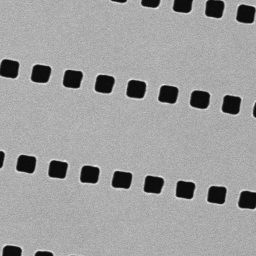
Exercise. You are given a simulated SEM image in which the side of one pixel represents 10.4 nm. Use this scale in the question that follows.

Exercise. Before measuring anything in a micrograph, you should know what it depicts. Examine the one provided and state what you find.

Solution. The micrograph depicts a regular array of holes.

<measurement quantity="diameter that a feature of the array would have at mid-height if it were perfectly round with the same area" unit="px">19.7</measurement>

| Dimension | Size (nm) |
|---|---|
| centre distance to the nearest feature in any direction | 335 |